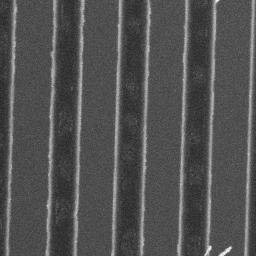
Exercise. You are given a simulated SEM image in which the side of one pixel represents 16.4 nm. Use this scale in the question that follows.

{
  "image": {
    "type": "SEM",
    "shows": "one or a few lines or trenches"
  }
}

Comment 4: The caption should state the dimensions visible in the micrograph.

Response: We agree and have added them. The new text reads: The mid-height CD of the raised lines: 632 nanometres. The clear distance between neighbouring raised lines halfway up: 462 nm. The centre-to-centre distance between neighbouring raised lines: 1090 nm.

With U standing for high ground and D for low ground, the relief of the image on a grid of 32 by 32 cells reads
DDUUUUUDDDUUUUUDDDDUUUUDDDDUUUUU
DDUUUUUDDDUUUUUDDDDUUUUDDDDUUUUU
DDUUUUUDDDUUUUUDDDDUUUUDDDDUUUUU
DDUUUUUDDDUUUUUDDDDUUUUDDDDUUUUU
DDUUUUUDDDUUUUUDDDDUUUUDDDDUUUUD
DDUUUUUDDDUUUUUDDDDUUUUDDDDUUUUD
DDUUUUUDDDUUUUUDDDUUUUUDDDDUUUUD
DDUUUUUDDDUUUUUDDDUUUUUDDDDUUUUD
DDUUUUUDDDUUUUUDDDUUUUUDDDDUUUUD
DDUUUUUDDDUUUUUDDDUUUUUDDDDUUUUD
DDUUUUUDDDUUUUUDDDUUUUUDDDDUUUUD
DUUUUUUDDDUUUUUDDDUUUUUDDDDUUUUD
DUUUUUDDDDUUUUUDDDUUUUUDDDDUUUUD
DUUUUUDDDDUUUUUDDDUUUUUDDDDUUUUD
DUUUUUDDDDUUUUUDDDUUUUUDDDUUUUUD
DUUUUUDDDDUUUUUDDDUUUUUDDDUUUUUD
DUUUUUDDDDUUUUUDDDUUUUUDDDUUUUUD
DUUUUUDDDDUUUUUDDDUUUUUDDDUUUUUD
DUUUUUDDDDUUUUUDDDUUUUUDDDUUUUUD
DUUUUUDDDDUUUUDDDDUUUUUDDDUUUUUD
DUUUUUDDDDUUUUDDDDUUUUUDDDUUUUUD
DUUUUUDDDDUUUUDDDDUUUUUDDDUUUUUD
DUUUUUDDDDUUUUDDDDUUUUUDDDUUUUUD
DUUUUUDDDDUUUUDDDDUUUUUDDDUUUUUD
DUUUUUDDDDUUUUDDDDUUUUUDDDUUUUUD
DUUUUUDDDDUUUUDDDDUUUUUDDDUUUUUD
DUUUUUDDDUUUUUDDDDUUUUUDDDUUUUUD
DUUUUUDDDUUUUUDDDDUUUUUDDDUUUUUD
DUUUUUDDDDUUUUDDDDUUUUUDDDUUUUUD
DUUUUUDDDUUUUUDDDDUUUUUDDDUUUUUD
DUUUUUDDDUUUUUDDDDUUUUDDDDUUUUUD
DUUUUUDDDUUUUUDDDDUUUUDDDDUUUUUD